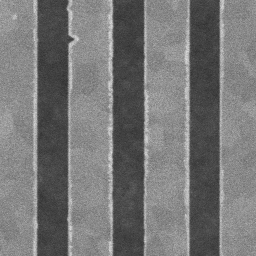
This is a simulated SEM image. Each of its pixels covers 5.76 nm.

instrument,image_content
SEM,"one or a few lines or trenches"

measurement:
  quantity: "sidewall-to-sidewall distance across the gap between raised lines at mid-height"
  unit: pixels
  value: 32.9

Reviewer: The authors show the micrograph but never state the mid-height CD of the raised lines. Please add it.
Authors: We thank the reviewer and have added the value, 0.248 µm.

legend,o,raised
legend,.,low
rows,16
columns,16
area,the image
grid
oo..ooo..ooo..oo
oo..ooo..ooo..oo
oo..ooo..ooo..oo
oo..ooo..ooo..oo
oo..ooo..ooo..oo
oo..ooo..ooo..oo
oo..ooo..ooo..oo
oo..ooo..ooo..oo
oo..ooo..ooo..oo
oo..ooo..ooo..oo
oo..ooo..ooo..oo
oo..ooo..ooo..oo
oo..ooo..ooo..oo
oo..ooo..ooo..oo
oo..ooo..ooo..oo
oo..ooo..ooo..oo